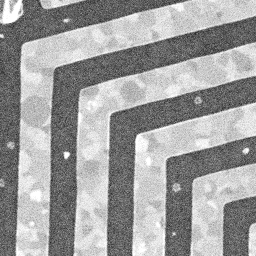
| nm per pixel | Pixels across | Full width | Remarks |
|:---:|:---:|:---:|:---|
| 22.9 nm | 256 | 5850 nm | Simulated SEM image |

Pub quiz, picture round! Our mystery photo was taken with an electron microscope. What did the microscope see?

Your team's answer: groups of lines, slits or small figures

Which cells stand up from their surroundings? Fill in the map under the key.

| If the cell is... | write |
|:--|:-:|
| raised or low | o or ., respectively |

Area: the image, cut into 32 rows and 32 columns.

ooo..oooo.............oooooooooo
ooo...............oooooooooooooo
oo............oooooooooooooooo..
..........oooooooooooooooo......
.......ooooooooooooooo..........
...ooooooooooooooo.............o
...ooooooooooo..............oooo
...ooooooo..............oooooooo
...oooo.............oooooooooooo
...oooo.........oooooooooooooooo
...oooo......ooooooooooooooo....
...ooo....oooooooooooooo........
...ooo....oooooooooo............
...ooo....oooooo..............oo
...ooo....oooo............oooooo
...ooo....oooo........oooooooooo
...ooo....ooo......ooooooooooooo
...ooo....ooo....oooooooooooo...
...ooo....ooo....ooooooooo......
...ooo....ooo....ooooo..........
..oooo....ooo....oooo...........
..oooo....ooo....oooo......ooooo
..oooo....ooo....oooo...oooooooo
..oooo....ooo....oooo...oooooooo
..oooo....ooo....oooo...oooooooo
..oooo....ooo....oooo...oooo....
..oooo....ooo....oooo...oooo....
..oooo....ooo....oooo...oooo....
..oooo....ooo....oooo...oooo...o
..oooo...oooo....oooo...oooo...o
..oooo...oooo....ooo....oooo...o
..oooo...oooo....ooo....oooo...o